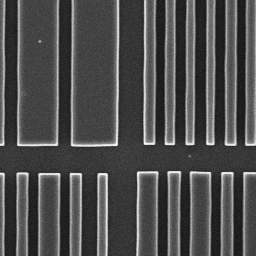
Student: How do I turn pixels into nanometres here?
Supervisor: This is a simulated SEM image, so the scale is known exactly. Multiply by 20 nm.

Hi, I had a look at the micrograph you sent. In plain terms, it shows groups of lines, slits or small figures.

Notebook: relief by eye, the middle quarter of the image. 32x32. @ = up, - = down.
--@@@@@@@@@@@-------@@@--@@@---@
--@@@@@@@@@@@-------@@@--@@@---@
--@@@@@@@@@@@-------@@@--@@@---@
--@@@@@@@@@@@-------@@@--@@@---@
--@@@@@@@@@@@-------@@@--@@@---@
--@@@@@@@@@@@-------@@@--@@@---@
--@@@@@@@@@@@-------@@@--@@@---@
--@@@@@@@@@@@-------@@@--@@@---@
--@@@@@@@@@@@-------@@@--@@@---@
--@@@@@@@@@@@-------@@@--@@@---@
--@@@@@@@@@@@-------@@@--@@@---@
--@@@@@@@@@@@-------@@@--@@@---@
--@@@@@@@@@@@-------@@@--@@@---@
--@@@@@@@@@@@-------@@@--@@@---@
--@@@@@@@@@@@-------@@---@@@---@
--@@@@@@@@@@@-------@@---@@@---@
--@@@@@@@@@@@-------@@---@@@---@
--@@@@@@@@@@@-------@@---@@@---@
--@@@@@@@@@@@-------@@---@@@---@
--@@@@@@@@@@@-------@@---@@@---@
--------------------------------
--------------------------------
--------------------------------
--------------------------------
--------------------------------
--------------------------------
--------------------------------
-------------------@@@@---@@@---
--@@-----@@--------@@@@---@@@---
--@@-----@@--------@@@@---@@@---
--@@-----@@--------@@@@---@@@---
--@@-----@@--------@@@@---@@@---